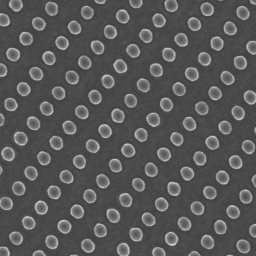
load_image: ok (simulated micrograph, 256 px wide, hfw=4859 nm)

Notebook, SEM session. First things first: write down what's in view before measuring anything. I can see a regular array of raised bodies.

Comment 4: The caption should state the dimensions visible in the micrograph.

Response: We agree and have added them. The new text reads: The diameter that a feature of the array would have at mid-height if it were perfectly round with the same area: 0.241 micrometres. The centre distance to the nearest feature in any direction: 19.7 px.